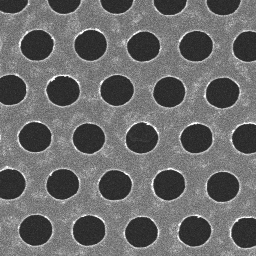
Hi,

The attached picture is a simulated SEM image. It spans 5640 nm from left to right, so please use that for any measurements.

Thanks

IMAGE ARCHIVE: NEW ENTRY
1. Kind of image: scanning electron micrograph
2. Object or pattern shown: a regular array of holes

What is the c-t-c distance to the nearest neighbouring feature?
1.15 um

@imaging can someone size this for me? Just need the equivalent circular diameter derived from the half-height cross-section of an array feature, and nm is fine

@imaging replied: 694